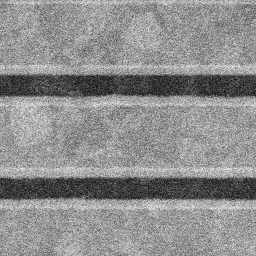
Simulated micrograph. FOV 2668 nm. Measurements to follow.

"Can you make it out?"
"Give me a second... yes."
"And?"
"one or a few lines or trenches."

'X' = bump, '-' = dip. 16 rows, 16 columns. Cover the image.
XXXXXXXXXXXXXXXX
XXXXXXXXXXXXXXXX
XXXXXXXXXXXXXXXX
XXXXXXXXXXXXXXXX
----------------
----------------
XXXXXXXXXXXXXXXX
XXXXXXXXXXXXXXXX
XXXXXXXXXXXXXXXX
XXXXXXXXXXXXXXXX
XXXXXXXXXXXXXXXX
----------------
----------------
XXXXXXXXXXXXXXXX
XXXXXXXXXXXXXXXX
XXXXXXXXXXXXXXXX